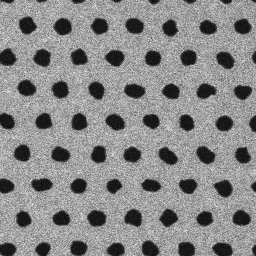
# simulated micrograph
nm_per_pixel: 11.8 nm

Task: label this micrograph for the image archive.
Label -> a regular array of holes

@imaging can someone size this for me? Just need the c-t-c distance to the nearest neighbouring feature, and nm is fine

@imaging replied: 412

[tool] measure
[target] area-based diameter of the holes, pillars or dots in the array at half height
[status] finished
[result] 197 nanometres